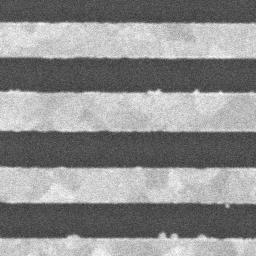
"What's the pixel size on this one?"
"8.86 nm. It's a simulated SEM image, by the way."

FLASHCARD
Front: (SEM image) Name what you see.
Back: lines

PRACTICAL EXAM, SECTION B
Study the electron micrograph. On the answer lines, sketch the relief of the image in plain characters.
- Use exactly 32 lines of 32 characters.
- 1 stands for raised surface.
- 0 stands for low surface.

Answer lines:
00000000000000000000000000000000
00000000000000000000000000000000
00000000000000000000000000000000
11111111111111111111111111111111
11111111111111111111111111111111
11111111111111111111111111111111
11111111111111111111111111111111
00000000000000000000000000000000
00000000000000000000000000000000
00000000000000000000000000000000
00000000000000000000000000000000
00000000000000000000000000000000
11111111111111111111111111111111
11111111111111111111111111111111
11111111111111111111111111111111
11111111111111111111111111111111
00000000000000000000000000000000
00000000000000000000000000000000
00000000000000000000000000000000
00000000000000000000000000000000
00000000000000000000000000000000
11111111111111111111111111111111
11111111111111111111111111111111
11111111111111111111111111111111
11111111111111111111111111111111
00000000000000000000000000000000
00000000000000000000000000000000
00000000000000000000000000000000
00000000000000000000000000000000
00000000000000000000000000000000
11111111111111111111111111111111
11111111111111111111111111111111